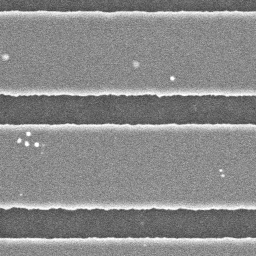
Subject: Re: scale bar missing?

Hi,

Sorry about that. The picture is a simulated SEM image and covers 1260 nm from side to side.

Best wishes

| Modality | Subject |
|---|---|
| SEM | lines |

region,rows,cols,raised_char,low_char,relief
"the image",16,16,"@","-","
----------------
@@@@@@@@@@@@@@@@
@@@@@@@@@@@@@@@@
@@@@@@@@@@@@@@@@
@@@@@@@@@@@@@@@@
@@@@@@@@@@@@@@@@
----------------
----------------
@@@@@@@@@@@@@@@@
@@@@@@@@@@@@@@@@
@@@@@@@@@@@@@@@@
@@@@@@@@@@@@@@@@
@@@@@@@@@@@@@@@@
----------------
----------------
@@@@@@@@@@@@@@@@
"